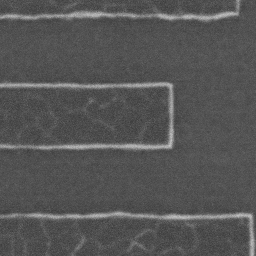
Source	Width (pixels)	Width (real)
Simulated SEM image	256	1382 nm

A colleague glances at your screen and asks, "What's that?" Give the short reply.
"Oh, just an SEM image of one or a few lines or trenches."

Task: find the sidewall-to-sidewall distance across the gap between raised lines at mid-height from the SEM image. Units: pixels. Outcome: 68.9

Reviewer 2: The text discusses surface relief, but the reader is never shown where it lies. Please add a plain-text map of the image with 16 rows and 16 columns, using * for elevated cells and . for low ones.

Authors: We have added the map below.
***************.
................
................
................
................
***********.....
***********.....
***********.....
***********.....
................
................
................
................
***...***.....*.
****************
****************